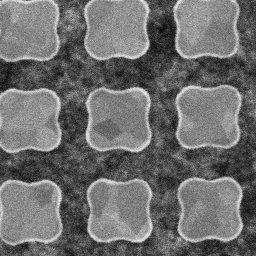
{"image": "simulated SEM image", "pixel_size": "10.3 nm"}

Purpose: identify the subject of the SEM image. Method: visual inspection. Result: raised bodies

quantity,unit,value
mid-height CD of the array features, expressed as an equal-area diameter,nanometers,687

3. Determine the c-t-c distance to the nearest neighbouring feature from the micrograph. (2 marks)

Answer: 0.926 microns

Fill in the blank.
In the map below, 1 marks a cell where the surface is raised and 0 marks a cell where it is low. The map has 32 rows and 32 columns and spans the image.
11111110000111111100001111111100
11111110000111111100001111111100
11111110000111111100001111111100
11111110000111111100001111111000
11111110000111111100001111111100
11111110000111111110001111111100
11111110000111111100001111111000
01000000000000000000000000000000
00000000000000000000000000000000
00000000000000000000000000000000
00000000000000000000000000000000
01101100000011111100000111111100
11111110000111111110001111111100
11111110000111111110001111111100
11111110000111111100001111111100
11111110000111111100001111111100
11111111000111111110001111111100
11111111000111111110001111111100
11111110000011111100000010000000
00000000000000000000000000000000
00000000000000000000000000000000
00000000000000000000000000000000
00000000000000000000000110011000
11111110000111111110000111111100
11111111000111111110001111111100
11111110000111111110000111111100
11111110000111111110000111111100
11111111000111111110000111111100
11111111000111111110001111111100
11111110000011111100000111111000
00000000000000000000000000000000
00000000000000000000000000000000